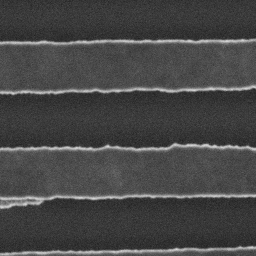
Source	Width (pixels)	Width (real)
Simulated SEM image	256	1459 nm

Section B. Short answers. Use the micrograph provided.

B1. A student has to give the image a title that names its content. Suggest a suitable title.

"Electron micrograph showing lines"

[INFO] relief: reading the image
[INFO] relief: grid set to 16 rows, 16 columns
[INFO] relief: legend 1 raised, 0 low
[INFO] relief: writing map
0000000000000000
0000000000000000
0000000000000001
1111111111111111
1111111111111111
1111111111111111
0000000000000000
0000000000000000
0000000000000000
1111111111111111
1111111111111111
1111111111111111
0000000000000000
0000000000000000
0000000000000000
0000000000000011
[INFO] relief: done